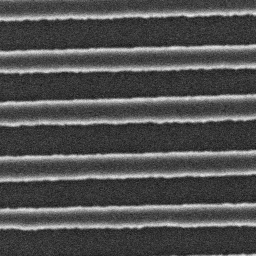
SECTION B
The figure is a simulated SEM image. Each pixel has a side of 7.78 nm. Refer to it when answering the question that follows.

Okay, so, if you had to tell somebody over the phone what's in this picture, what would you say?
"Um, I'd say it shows lines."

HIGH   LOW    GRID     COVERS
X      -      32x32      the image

XXXXXXXXXXXXXXXXXXXXXXXXXXXXXXXX
XXXXXXXXXXXXXXXXXXXXXXXXXXXXXXXX
XXX-X---------------------------
--------------------------------
--------------------------------
--------------------------------
-XXXXXXXXXXXXXXXXXXXXXXXXXXXXXXX
XXXXXXXXXXXXXXXXXXXXXXXXXXXXXXXX
XXXXXXXXXXXXXXXXXXXXXXXXXXX--X--
--------------------------------
--------------------------------
--------------------------------
------------XXXXXXXXXXXXXXXXXXXX
XXXXXXXXXXXXXXXXXXXXXXXXXXXXXXXX
XXXXXXXXXXXXXXXXXXXXXXXXXXXXXXXX
XXXXX--X--X---------------------
--------------------------------
--------------------------------
--------------------------------
------XXXXXXXXXXXXXXXXXXXXXXXXXX
XXXXXXXXXXXXXXXXXXXXXXXXXXXXXXXX
XXXXXXXXXXXXXXXXXXXXXXXXXXXXXXXX
XXXX----------------------------
--------------------------------
--------------------------------
--------------------------------
XXXXXXXXXXXXXXXXXXXXXXXXXXXXXXXX
XXXXXXXXXXXXXXXXXXXXXXXXXXXXXXXX
XXXXXXX-------X-----------------
--------------------------------
--------------------------------
--------------------------------